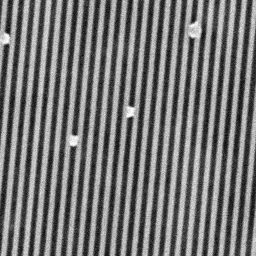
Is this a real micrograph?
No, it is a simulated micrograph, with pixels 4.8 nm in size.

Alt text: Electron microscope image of parallel lines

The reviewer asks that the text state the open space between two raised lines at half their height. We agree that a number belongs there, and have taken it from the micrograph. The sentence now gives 32.9 nm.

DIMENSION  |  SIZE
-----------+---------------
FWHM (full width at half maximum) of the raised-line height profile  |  0.0191 µm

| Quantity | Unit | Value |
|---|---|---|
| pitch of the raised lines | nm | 52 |